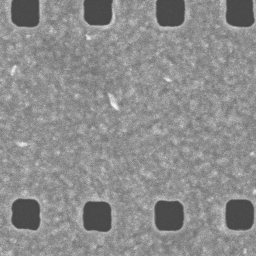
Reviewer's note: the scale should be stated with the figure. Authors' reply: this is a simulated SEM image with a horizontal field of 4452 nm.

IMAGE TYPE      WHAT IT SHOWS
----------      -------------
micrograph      holes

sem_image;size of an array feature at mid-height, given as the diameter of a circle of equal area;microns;0.568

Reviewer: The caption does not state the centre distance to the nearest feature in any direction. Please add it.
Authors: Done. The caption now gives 70.9 px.